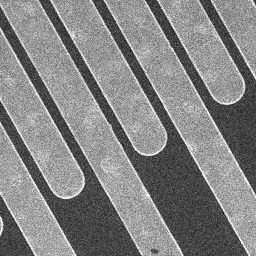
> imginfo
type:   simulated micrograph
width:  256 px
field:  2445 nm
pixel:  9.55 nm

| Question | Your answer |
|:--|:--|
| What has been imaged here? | parallel lines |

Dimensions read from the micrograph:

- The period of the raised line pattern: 0.441 um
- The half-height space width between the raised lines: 0.104 µm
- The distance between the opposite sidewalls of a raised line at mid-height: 345 nm